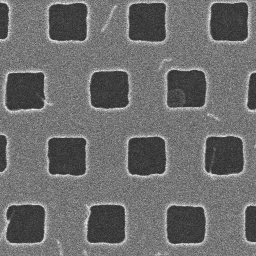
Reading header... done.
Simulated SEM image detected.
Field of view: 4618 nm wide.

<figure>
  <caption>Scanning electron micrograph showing a regular array of holes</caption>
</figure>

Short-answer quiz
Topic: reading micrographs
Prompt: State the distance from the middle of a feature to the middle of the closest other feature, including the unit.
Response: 1.39 um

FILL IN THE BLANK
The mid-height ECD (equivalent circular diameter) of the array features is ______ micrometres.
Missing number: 0.758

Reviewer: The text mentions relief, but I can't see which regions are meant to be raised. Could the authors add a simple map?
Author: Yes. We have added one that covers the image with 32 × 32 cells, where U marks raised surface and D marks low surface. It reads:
DUUUUUUUUDUUUUUUUDDDUUUUUUUDDDDU
DUUUUUDDDDDUUUUUDDDDDUUUUUDDDDDU
DUUUUUDDDDDUUUUUDDDDDUUUUUDDDDDU
DUUUUUDDDDDUUUUUDDDDDUUUUUDDDDDU
DUUUUUDDDDDUUUUUDDDDDUUUUUDDDDDU
UUUUUUUUUUUUUUUUUUUUUUUUUUUUUUUU
UUUUUUUUUUUUUUUUUUUUUUUUUUUUUUUU
UUUUUUUUUUUUUUUUUUUUUUUUUUUUUUUU
UUUUUUUUUUUUUUUUUUUUUUUUUUUUUUUU
UDDDDDUUUUUDDDDDUUUUUDDDDDUUUUUD
UDDDDDUUUUUDDDDDUUUUUDDDDDUUUUUD
UDDDDDUUUUUDDDDDUUUUUDDDDDUUUUUD
UDDDDUUUUUUDDDDDUUUUUDDDDDUUUUUD
UDDDDUUUUUUUDDDUUUUUUUUUUUUUUUUD
UUUUUUUUUUUUUUUUUUUUUUUUUUUUUUUU
UUUUUUUUUUUUUUUUUUUUUUUUUUUUUUUU
UUUUUUUUUUUUUUUUUUUUUUUUUUUUUUUU
DUUUUUDDDDUUUUUUDDDDUUUUUUDDDDUU
DUUUUUDDDDDUUUUUDDDDDUUUUUDDDDUU
DUUUUUDDDDDUUUUUDDDDDUUUUUDDDDUU
DUUUUUDDDDDUUUUUDDDDDUUUUDDDDDUU
UUUUUUDDDDDUUUUUDDDDUUUUUUDDDDUU
UUUUUUUUUUUUUUUUUUUUUUUUUUUUUUUU
UUUUUUUUUUUUUUUUUUUUUUUUUUUUUUUU
UUUUUUUUUUUUUUUUUUUUUUUUUUUUUUUU
UUUUUUUUUUUUUDUUUUUUUUUUUUUUUUUU
UDDDDDUUUUUDDDDDUUUUUDDDDDUUUUUD
UDDDDDUUUUUDDDDDUUUUUDDDDDUUUUUD
UDDDDDUUUUUDDDDDUUUUUDDDDDUUUUUD
UDDDDDUUUUUDDDDDUUUUUDDDDDUUUUUD
UUUUUUUUUUUUUUUUUUUUUUUUUUUUUUUU
UUUUUUUUUUUUUUUUUUUUUUUUUUUUUUUU